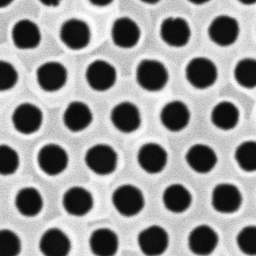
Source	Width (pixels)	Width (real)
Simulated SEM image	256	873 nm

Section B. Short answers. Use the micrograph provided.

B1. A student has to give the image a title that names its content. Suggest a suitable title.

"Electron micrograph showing a regular array of holes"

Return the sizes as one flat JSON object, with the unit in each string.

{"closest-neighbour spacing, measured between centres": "0.165 microns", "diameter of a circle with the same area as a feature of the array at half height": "0.0995 microns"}